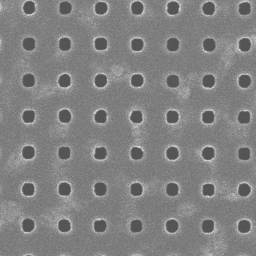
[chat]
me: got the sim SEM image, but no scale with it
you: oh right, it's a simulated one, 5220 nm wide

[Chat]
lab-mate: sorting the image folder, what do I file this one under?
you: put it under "a regular array of holes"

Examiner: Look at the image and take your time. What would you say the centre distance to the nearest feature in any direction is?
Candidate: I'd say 727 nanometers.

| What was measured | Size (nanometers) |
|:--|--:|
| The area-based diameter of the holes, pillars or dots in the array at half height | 276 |